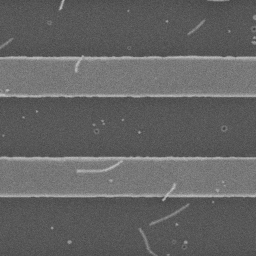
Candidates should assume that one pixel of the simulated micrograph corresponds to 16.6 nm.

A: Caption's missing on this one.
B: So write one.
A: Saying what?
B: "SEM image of lines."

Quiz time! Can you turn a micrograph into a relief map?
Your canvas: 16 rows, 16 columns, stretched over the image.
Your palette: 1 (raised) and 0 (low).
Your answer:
0000000000000000
0000000000000000
0000000000000000
0000000000000000
1111111111111111
1111111111111111
0000000000000000
0000000000000000
0000000000000000
0000000000000000
1111111111111111
1111111111111111
0000000000000000
0000000000000000
0000000000000000
0000000000000000